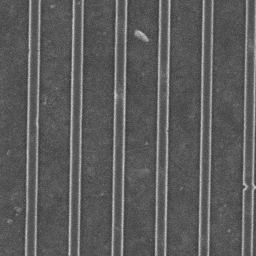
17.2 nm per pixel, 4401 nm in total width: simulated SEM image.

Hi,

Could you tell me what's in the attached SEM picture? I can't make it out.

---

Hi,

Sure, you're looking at parallel lines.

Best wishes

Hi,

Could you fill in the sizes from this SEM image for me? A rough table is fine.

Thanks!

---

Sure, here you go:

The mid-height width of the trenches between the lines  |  569 nm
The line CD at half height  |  163 nanometers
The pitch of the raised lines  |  0.744 microns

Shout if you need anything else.